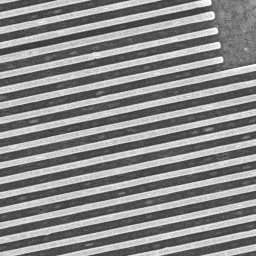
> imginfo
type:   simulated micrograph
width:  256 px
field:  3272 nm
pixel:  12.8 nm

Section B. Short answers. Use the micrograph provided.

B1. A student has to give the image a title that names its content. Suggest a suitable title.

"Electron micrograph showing parallel lines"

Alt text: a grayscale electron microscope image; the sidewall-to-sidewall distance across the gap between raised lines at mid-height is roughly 110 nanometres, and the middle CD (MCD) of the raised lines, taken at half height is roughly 72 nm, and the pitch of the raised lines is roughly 188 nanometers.